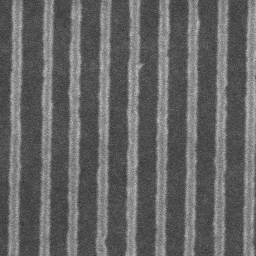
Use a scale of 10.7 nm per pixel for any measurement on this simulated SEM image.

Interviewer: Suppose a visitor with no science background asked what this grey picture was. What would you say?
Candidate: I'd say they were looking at parallel lines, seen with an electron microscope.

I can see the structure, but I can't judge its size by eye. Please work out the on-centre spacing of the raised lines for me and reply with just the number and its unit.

314 nanometres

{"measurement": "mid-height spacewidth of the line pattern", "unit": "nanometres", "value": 228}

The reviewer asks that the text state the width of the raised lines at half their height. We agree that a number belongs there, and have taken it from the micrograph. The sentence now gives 80.1 nanometers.